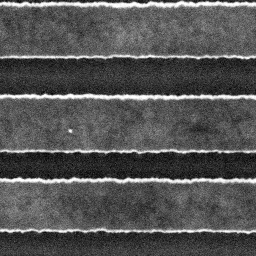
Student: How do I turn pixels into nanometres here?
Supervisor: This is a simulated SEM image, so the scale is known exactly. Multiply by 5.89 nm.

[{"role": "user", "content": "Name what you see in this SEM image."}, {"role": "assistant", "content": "lines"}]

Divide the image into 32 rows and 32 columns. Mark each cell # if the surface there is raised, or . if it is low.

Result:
################################
################################
################################
################################
################################
################################
################################
................................
................................
................................
................................
................................
################################
################################
################################
################################
################################
################################
################################
................................
................................
................................
#####....######.#####...####.#..
################################
################################
################################
################################
################################
################################
................................
................................
................................